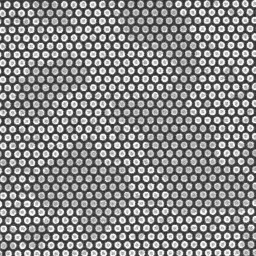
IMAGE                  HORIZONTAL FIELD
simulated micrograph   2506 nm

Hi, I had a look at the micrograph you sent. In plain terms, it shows a regular array of raised bodies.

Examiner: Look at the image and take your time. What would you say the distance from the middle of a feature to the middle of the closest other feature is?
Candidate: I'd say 0.0892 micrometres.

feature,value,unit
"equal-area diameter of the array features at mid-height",62.5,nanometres